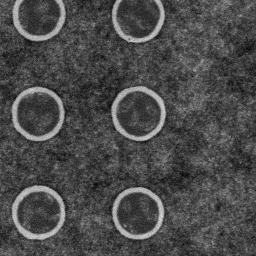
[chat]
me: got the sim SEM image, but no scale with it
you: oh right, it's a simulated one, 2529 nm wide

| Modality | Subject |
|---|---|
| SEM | raised bodies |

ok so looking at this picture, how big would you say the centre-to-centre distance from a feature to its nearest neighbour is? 976 nanometers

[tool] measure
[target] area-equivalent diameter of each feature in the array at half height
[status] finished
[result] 488 nanometers